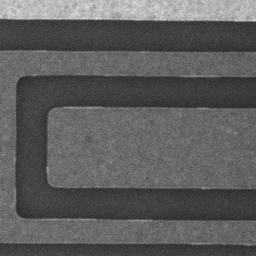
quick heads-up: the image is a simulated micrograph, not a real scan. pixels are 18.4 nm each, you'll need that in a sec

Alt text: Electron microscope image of groups of lines, slits or small figures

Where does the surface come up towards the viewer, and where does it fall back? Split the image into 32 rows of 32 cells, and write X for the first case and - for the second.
XXXXXXXXXXXXXXXXXXXXXXXXXXXXXXXX
XXXXXXXXXXXXXXXXXXXXXXXXXXXXXXXX
---------------------------XXXXX
--------------------------------
--------------------------------
--------------------------------
XXXXXXX-------------------------
XXXXXXXXXXXXXXXXXXXXXXXXXXXXXXXX
XXXXXXXXXXXXXXXXXXXXXXXXXXXXXXXX
XXX-----------------------------
XX------------------------------
XX------------------------------
XX------------------------------
XX-----XXXXXXXXXXXXXX-----------
XX----XXXXXXXXXXXXXXXXXXXXXXXXXX
XX----XXXXXXXXXXXXXXXXXXXXXXXXXX
XX----XXXXXXXXXXXXXXXXXXXXXXXXXX
XX----XXXXXXXXXXXXXXXXXXXXXXXXXX
XX----XXXXXXXXXXXXXXXXXXXXXXXXXX
XX----XXXXXXXXXXXXXXXXXXXXXXXXXX
XX----XXXXXXXXXXXXXXXXXXXXXXXXXX
XX----XXXXXXXXXXXXXXXXXXXXXXXXXX
XX----XXXXXXXXXXXXXXXXXXXXXXXXXX
XX------------------------------
XX------------------------------
XX------------------------------
XX------------------------------
XXXXXXXXXXXXX-------------------
XXXXXXXXXXXXXXXXXXXXXXXXXXXXXXXX
XXXXXXXXXXXXXXXXXXXXXXXXXXXXXXXX
-----------------------------XXX
--------------------------------